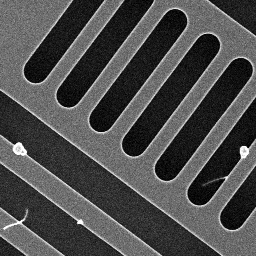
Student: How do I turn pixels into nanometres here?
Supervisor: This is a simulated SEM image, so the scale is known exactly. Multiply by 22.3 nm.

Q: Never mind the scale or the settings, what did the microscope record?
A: groups of lines, slits or small figures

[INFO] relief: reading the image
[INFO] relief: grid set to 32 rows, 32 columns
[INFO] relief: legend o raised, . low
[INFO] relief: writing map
ooooooooo....oo....oooooooo.....
oooooooo....oo....ooo..ooooo....
ooooooo....ooo....oo...oooooo...
ooooooo...ooo....oo....oooooooo.
oooooo....oo....ooo...ooo..ooooo
ooooo....oo....ooo....oo...ooooo
oooo....ooo....oo....oo....ooooo
oooo...ooo....oo....ooo....oo..o
ooo....oo....ooo...ooo....oo....
ooo...oo....ooo....oo....ooo...o
oooooooo....oo....oo....ooo....o
ooooooo....oo....ooo....oo....oo
..ooooo...ooo...ooo....oo....ooo
...ooooooooo....oo....ooo....oo.
....ooooooo....oo....ooo....oo..
......ooooo...ooo....oo....oo...
.......ooooooooo....oo....ooo...
o.......ooooooo....ooo...ooo....
ooo.......ooooo...ooo....oo...oo
oooo.......ooooo.ooo....oo....oo
ooooo.......ooooooo....ooo....oo
..oooo........ooooo....oo....oo.
...ooooo.......ooooo.ooo....ooo.
....ooooo.......oooooooo...ooo..
......oooo........oooooo...oo...
.......ooooo.......ooooo..oo....
o.......ooooo.......oooooooo....
oo.......ooooo........oooooo...o
ooo........ooooo.......ooooo..oo
ooooo.......ooooo.......oooooooo
.ooooo........oooo........oooooo
...oooo........ooooo.......ooooo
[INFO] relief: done